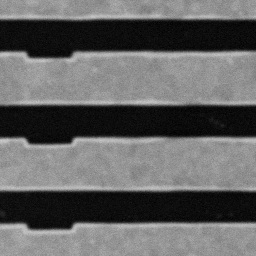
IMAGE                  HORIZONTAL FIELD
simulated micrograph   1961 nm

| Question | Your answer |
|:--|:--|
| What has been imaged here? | wiring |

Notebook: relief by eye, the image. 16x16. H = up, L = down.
HHHHHHHHHHHHHHHH
LLLLLLLLLLLLLLLL
LLLLLLLLLLLLLLLL
HLLLLHHHHHHHHHHH
HHHHHHHHHHHHHHHH
HHHHHHHHHHHHHHHH
HLLLLLLLLLLHHLLL
LLLLLLLLLLLLLLLL
LLLLLLLLLLLLLLLL
HHHHHHHHHHHHHHHH
HHHHHHHHHHHHHHHH
HHHHHHHHHHHHHHHH
LLLLLLLLLLLLLLLL
LLLLLLLLLLLLLLLL
HHLLHHHHHHHHHHHH
HHHHHHHHHHHHHHHH